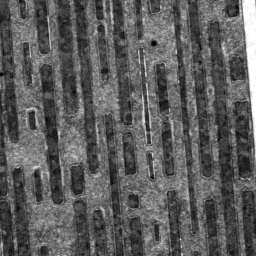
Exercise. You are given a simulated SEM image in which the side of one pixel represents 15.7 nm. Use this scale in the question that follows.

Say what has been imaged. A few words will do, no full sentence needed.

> parallel lines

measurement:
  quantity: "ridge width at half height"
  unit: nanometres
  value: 156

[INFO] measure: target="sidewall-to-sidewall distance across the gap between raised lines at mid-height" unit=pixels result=9.97